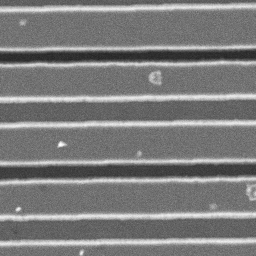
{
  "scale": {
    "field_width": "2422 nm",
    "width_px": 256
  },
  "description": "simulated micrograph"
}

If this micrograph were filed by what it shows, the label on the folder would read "lines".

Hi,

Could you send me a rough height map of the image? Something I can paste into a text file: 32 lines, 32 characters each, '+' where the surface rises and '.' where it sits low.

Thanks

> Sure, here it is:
................................
++++++++++++++++++++++++++++++++
++++++++++++++++++++++++++++++++
++++++++++++++++++++++++++++++++
++++++++++++++++++++++++++++++++
++++++++++++++++++++++++++++++++
................................
................................
++++++++++++++++++++++++++++++++
++++++++++++++++++++++++++++++++
++++++++++++++++++++++++++++++++
++++++++++++++++++++++++++++++++
++++..+++.......................
................................
................................
.........+++++++++++++++++++++++
++++++++++++++++++++++++++++++++
++++++++++++++++++++++++++++++++
++++++++++++++++++++++++++++++++
++++++++++++++++++++++++++++++++
++++++..........................
................................
......+...++++++++++++++++++++++
++++++++++++++++++++++++++++++++
++++++++++++++++++++++++++++++++
++++++++++++++++++++++++++++++++
++++++++++++++++++++++++++++++++
................................
................................
................................
++++++++++++++++++++++++++++++++
++++++++++++++++++++++++++++++++